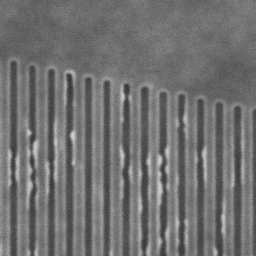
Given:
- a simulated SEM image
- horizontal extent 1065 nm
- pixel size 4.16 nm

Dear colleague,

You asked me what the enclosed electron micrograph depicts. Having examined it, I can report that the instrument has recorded parallel lines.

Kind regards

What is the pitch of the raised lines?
77.7 nm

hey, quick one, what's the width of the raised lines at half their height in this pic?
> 0.0463 microns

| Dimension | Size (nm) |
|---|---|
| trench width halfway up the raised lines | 31.8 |